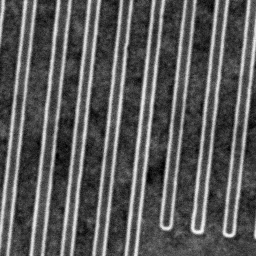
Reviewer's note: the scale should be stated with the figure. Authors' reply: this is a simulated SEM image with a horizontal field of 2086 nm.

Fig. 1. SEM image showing parallel lines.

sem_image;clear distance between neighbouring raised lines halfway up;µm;0.178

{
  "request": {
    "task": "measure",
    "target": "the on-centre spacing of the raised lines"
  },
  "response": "31.7 pixels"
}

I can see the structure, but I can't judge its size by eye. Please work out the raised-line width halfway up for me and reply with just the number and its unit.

85.1 nm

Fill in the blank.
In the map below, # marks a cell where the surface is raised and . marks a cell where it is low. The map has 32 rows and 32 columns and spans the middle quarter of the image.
.....##......##......##......##.
.....##.....###......##......##.
....###.....###......##.....###.
....###.....###.....###.....###.
....##......###.....###.....###.
....##......###.....##......###.
....##......##......##......##..
....##......##......##......##..
....##......##......##......##..
....##......##......##......##..
....##......##......##......##..
...###.....###......##.....###..
...###.....###.....###.....###..
...###.....###.....###.....###..
...##......###.....##......###..
...##......##......##......##...
...##......##......##......##...
...##......##......##......##...
...##......##......##......##...
...##......##......##......##...
...##.....###......##.....###...
..###.....###.....###.....###...
..###.....###.....###.....##....
..##......###.....##......##....
..##......##......##......##....
..##......##......##......##....
..##......##......##......##....
..##......##......##......##....
..##......##......##......##....
..##.....###......##.....###....
.###.....###.....###.....###....
.###.....###.....###.....###....